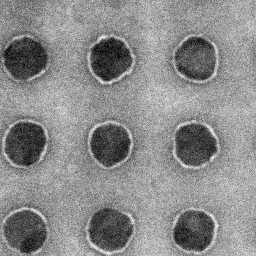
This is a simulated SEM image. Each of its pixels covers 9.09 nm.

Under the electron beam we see a regular array of raised bodies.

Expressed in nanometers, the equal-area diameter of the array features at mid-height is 419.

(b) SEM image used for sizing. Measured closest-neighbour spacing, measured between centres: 771 nanometres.